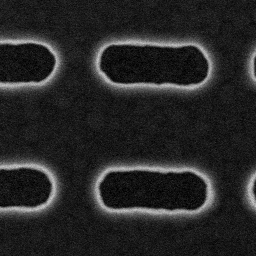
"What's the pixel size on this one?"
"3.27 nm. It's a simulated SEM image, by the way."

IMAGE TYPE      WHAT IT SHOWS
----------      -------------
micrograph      holes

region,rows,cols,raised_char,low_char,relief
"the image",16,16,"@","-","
@@@@@@@@@@@@@@@@
@@@@@@@@@@@@@@@@
@@@@@@@@@@@@@@@@
---@@@-------@@@
---@@@-------@@@
@@@@@@@@@@@@@@@@
@@@@@@@@@@@@@@@@
@@@@@@@@@@@@@@@@
@@@@@@@@@@@@@@@@
@@@@@@@@@@@@@@@@
@-@@@@@@@@@@@@@@
---@@@-------@@@
---@@@-------@@@
@@@@@@@@@@@@@@@@
@@@@@@@@@@@@@@@@
@@@@@@@@@@@@@@@@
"